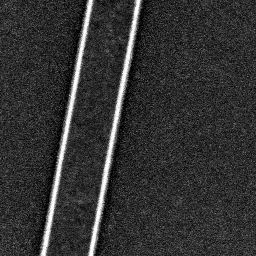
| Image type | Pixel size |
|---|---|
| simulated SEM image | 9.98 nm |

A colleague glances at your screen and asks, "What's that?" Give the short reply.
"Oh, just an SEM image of one or a few lines or trenches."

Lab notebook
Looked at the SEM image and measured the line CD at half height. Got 47.1 px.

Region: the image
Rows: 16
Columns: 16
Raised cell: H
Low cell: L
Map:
LLLLLLHHHLLLLLLL
LLLLLHHHLLLLLLLL
LLLLLHHHLLLLLLLL
LLLLLHHHLLLLLLLL
LLLLLHHHLLLLLLLL
LLLLLHHHLLLLLLLL
LLLLHHHLLLLLLLLL
LLLLHHHLLLLLLLLL
LLLLHHHLLLLLLLLL
LLLLHHHLLLLLLLLL
LLLLHHHLLLLLLLLL
LLLLHHLLLLLLLLLL
LLLHHHLLLLLLLLLL
LLLHHHLLLLLLLLLL
LLLHHHLLLLLLLLLL
LLLHHHLLLLLLLLLL